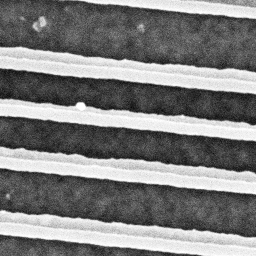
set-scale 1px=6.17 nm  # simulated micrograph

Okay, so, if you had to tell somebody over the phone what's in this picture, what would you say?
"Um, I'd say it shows lines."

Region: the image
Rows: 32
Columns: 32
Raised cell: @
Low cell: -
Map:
---------------@@@@@@@@@@@@@@@@@
-----------------------@@@@@@@@@
--------------------------------
--------------------------------
--------------------------------
--------------------------------
@@@@@@--------------------------
@@@@@@@@@@@@@@------------------
@@@@@@@@@@@@@@@@@@@@@@@@@-------
---------@@@@@@@@@@@@@@@@@@@@@@@
--------------------@@@@@@@@@@@@
-------------------------------@
@@------------------------------
@@@@@@@@@@@@--------------------
-@@@@@@@@@@@@@@@@@@@--@---------
-----------@@@@@@@@@@@@@@@@@@@@-
----------------------@@@@@@@@@@
--------------------------------
@-------------------------------
@@@@@@@@@@----------------------
@@@@@@@@@@@@@@@@@@@@------------
------@@@@@@@@@@@@@@@@@@@@@@@@@-
---------------@@@@@@@@@@@@@@@@@
------------------------@@@@@@@@
--------------------------------
--------------------------------
@-------------------------------
@@@@@@@@@@@---------------------
@@@@@@@@@@@@@@@@@@@@@-----------
--@@@@@@@@@@@@@@@@@@@@@@@@@@@@--
------------@@@@@@@@@@@@@@@@@@@@
----------------------@@@@@@@@@@